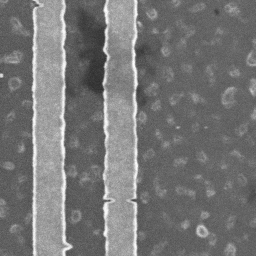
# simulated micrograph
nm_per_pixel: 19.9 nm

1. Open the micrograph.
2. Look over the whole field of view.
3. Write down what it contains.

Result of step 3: one or a few lines or trenches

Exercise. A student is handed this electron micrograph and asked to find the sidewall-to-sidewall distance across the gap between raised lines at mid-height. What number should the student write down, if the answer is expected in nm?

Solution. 848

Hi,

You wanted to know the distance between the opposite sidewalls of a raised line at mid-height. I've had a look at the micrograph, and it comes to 591 nm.